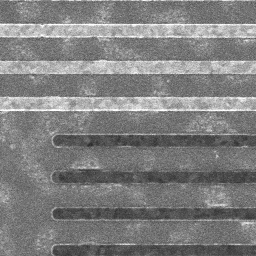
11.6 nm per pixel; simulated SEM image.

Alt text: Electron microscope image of parallel lines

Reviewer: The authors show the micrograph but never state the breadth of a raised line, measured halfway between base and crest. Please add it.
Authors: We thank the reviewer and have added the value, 0.145 micrometres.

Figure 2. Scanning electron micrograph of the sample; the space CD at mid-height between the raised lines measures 276 nm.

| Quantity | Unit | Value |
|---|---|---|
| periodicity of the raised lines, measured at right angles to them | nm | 423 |